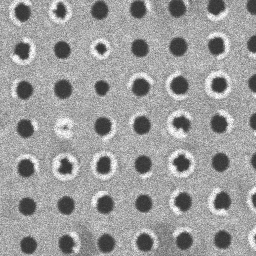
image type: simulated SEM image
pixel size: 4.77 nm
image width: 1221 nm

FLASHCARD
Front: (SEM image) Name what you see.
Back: a regular array of holes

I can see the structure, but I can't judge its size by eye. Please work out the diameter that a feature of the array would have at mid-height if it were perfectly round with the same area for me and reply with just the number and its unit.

0.0803 um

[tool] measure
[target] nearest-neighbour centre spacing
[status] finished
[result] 0.183 um